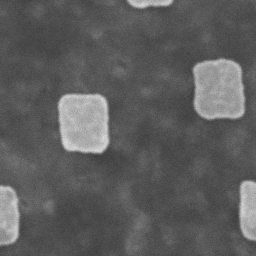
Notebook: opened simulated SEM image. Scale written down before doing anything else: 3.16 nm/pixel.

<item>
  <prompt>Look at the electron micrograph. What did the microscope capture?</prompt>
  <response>raised bodies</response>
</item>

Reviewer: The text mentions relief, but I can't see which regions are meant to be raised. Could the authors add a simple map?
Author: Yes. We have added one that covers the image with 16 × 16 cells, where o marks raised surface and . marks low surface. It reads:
................
................
................
................
............ooo.
............ooo.
....ooo.....ooo.
....ooo.........
....ooo.........
................
................
...............o
o..............o
o..............o
o..............o
................